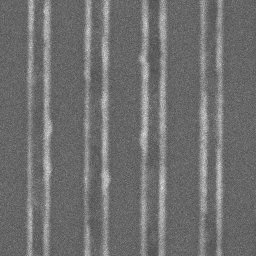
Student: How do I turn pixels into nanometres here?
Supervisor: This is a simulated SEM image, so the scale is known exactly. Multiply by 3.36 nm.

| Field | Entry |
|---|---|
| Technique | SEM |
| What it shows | parallel lines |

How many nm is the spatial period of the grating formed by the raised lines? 193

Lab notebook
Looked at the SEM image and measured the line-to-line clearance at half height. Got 124 nanometres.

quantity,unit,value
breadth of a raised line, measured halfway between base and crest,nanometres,68.4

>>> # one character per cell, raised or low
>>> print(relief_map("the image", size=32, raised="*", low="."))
....**.....**.....**.....***....
....**.....**.....**.....***....
....**.....**.....**.....***....
....**.....**.....***....***....
....**.....**.....***....***....
....**.....**.....***....***....
....**.....**.....***....***....
....**.....**.....***....***....
....**.....**.....**.....***....
....**.....**.....***....***....
....**.....**.....**.....***....
....**.....**.....**.....***....
....**.....**.....**.....**.....
....**.....**.....**.....**.....
....**.....**.....**.....**.....
....**.....**.....**.....**.....
....**.....**.....**.....**.....
....**.....**.....**.....***....
....**.....**.....**.....**.....
....**.....**.....**.....***....
....**.....**.....**.....***....
....**.....***....**.....***....
....**.....***....**.....***....
....**.....**.....**.....***....
....**.....**.....**.....***....
....**.....**.....**.....***....
....**.....**.....**.....***....
....**.....**.....**.....***....
....**.....**.....**.....***....
....**.....**.....**.....***....
....**.....**.....**.....***....
....**.....**.....**.....***....